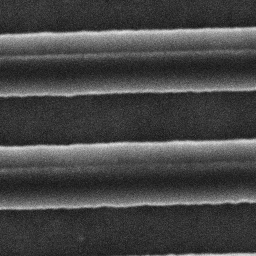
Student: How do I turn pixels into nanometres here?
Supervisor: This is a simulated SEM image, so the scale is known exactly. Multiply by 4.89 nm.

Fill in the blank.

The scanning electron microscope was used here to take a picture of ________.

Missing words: lines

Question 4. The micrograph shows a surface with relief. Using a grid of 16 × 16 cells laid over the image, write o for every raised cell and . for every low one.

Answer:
................
................
oooooooooooooooo
oooooooooooooooo
oooooooooooooooo
oooooooooooooooo
................
................
................
oooooooooooooooo
oooooooooooooooo
oooooooooooooooo
oooooooooooooooo
................
................
................